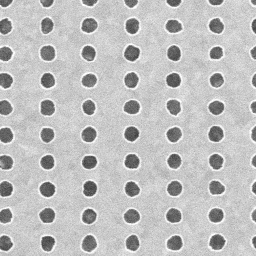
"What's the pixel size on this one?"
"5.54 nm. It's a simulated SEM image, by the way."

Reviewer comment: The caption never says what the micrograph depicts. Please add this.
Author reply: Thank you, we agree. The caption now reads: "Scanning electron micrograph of a regular array of holes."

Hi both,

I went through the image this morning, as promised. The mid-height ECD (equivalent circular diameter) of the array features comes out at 0.0888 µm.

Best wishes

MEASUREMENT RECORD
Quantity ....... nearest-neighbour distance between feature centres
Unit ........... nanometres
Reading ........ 150